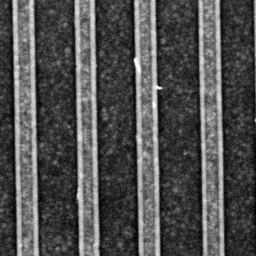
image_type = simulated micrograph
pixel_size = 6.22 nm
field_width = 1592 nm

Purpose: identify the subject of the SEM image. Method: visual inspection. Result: one or a few lines or trenches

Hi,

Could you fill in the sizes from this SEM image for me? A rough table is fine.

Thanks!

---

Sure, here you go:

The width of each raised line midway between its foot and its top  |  103 nanometres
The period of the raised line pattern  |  385 nm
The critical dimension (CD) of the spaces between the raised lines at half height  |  287 nanometers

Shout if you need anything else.